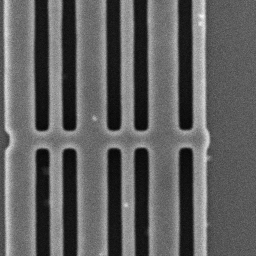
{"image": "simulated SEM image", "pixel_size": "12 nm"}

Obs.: groups of lines, slits or small figures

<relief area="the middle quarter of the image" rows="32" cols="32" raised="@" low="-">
---@@@@@@@----@@@----@@@@@@@----
---@@@@@@@----@@@----@@@@@@@----
---@@@@@@@----@@@----@@@@@@@----
---@@@@@@@----@@@----@@@@@@@----
---@@@@@@@@---@@@----@@@@@@@----
---@@@@@@@@---@@@----@@@@@@@----
---@@@@@@@@---@@@----@@@@@@@----
---@@@@@@@@---@@@----@@@@@@@----
---@@@@@@@@---@@@----@@@@@@@----
---@@@@@@@@---@@@----@@@@@@@----
---@@@@@@@@---@@@----@@@@@@@----
---@@@@@@@@---@@@----@@@@@@@----
---@@@@@@@@---@@@----@@@@@@@@---
---@@@@@@@@---@@@----@@@@@@@@---
---@@@@@@@@---@@@----@@@@@@@@---
---@@@@@@@@---@@@----@@@@@@@@---
---@@@@@@@@---@@@@---@@@@@@@@@-@
@@@@@@@@@@@@@@@@@@@@@@@@@@@@@@@@
@@@@@@@@@@@@@@@@@@@@@@@@@@@@@@@@
@@@@@@@@@@@@@@@@@@@@@@@@@@@@@@@@
@@@@@@@@@@@@@@@@@@@@@@@@@@@@@@@@
---@@@@@@@@---@@@@---@@@@@@@@---
---@@@@@@@@---@@@----@@@@@@@@---
---@@@@@@@@---@@@----@@@@@@@@---
---@@@@@@@@---@@@----@@@@@@@@---
---@@@@@@@@---@@@----@@@@@@@@---
---@@@@@@@@---@@@----@@@@@@@@---
---@@@@@@@@---@@@----@@@@@@@@---
---@@@@@@@@---@@@----@@@@@@@@---
---@@@@@@@@---@@@----@@@@@@@@---
---@@@@@@@@---@@@----@@@@@@@@---
---@@@@@@@@---@@@----@@@@@@@@---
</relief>